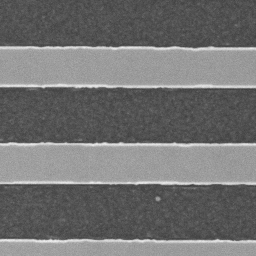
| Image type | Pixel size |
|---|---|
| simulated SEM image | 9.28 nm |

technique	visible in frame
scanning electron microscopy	lines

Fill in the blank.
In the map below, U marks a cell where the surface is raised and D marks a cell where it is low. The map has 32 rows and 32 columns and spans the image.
DDDDDDDDDDDDDDDDDDDDDDDDDDDDDDDD
DDDDDDDDDDDDDDDDDDDDDDDDDDDDDDDD
DDDDDDDDDDDDDDDDDDDDDDDDDDDDDDDD
DDDDDDDDDDDDDDDDDDDDDDDDDDDDDDDD
DDDDDDDDDDDDDDDDDDDDDDDDDDDDDDDD
DDDDDDDDDDDDDDDDDDDDDDDDDDDDDDDD
UUUUUUUUUUUUUUUUUUUUUUUUUUUUUUUU
UUUUUUUUUUUUUUUUUUUUUUUUUUUUUUUU
UUUUUUUUUUUUUUUUUUUUUUUUUUUUUUUU
UUUUUUUUUUUUUUUUUUUUUUUUUUUUUUUU
UUUUUUUUUUUUUUUUUUUUUUUUUUUUUUUU
DDDDDDDDDDDDDDDDDDDDDDDDDDDDDDDD
DDDDDDDDDDDDDDDDDDDDDDDDDDDDDDDD
DDDDDDDDDDDDDDDDDDDDDDDDDDDDDDDD
DDDDDDDDDDDDDDDDDDDDDDDDDDDDDDDD
DDDDDDDDDDDDDDDDDDDDDDDDDDDDDDDD
DDDDDDDDDDDDDDDDDDDDDDDDDDDDDDDD
DDDDDDDDDDDDDDDDDDDDDDDDDDDDDDDD
UUUUUUUUUUUUUUUUUUUUUUUUUUUUUUUU
UUUUUUUUUUUUUUUUUUUUUUUUUUUUUUUU
UUUUUUUUUUUUUUUUUUUUUUUUUUUUUUUU
UUUUUUUUUUUUUUUUUUUUUUUUUUUUUUUU
UUUUUUUUUUUUUUUUUUUUUUUUUUUUUUUU
DDDDDDDDDDDDDDDDDDDDDDDDDDDDDDDD
DDDDDDDDDDDDDDDDDDDDDDDDDDDDDDDD
DDDDDDDDDDDDDDDDDDDDDDDDDDDDDDDD
DDDDDDDDDDDDDDDDDDDDDDDDDDDDDDDD
DDDDDDDDDDDDDDDDDDDDDDDDDDDDDDDD
DDDDDDDDDDDDDDDDDDDDDDDDDDDDDDDD
DDDDDDDDDDDDDDDDDDDDDDDDDDDDDDDD
UUUUUUUUUUUUUUUUUUUUUUUUUUUUUUUU
UUUUUUUUUUUUUUUUUUUUUUUUUUUUUUUU